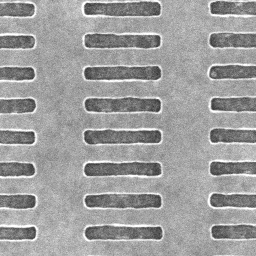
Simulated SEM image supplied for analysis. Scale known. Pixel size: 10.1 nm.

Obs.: a regular array of holes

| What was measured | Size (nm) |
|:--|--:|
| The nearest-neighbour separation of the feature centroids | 322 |